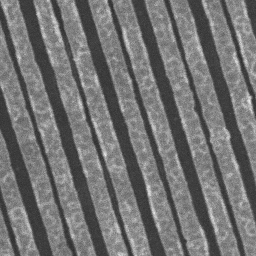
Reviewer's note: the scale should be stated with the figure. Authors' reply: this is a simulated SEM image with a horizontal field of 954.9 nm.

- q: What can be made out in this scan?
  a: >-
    parallel lines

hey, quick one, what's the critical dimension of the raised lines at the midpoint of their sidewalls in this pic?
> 0.0634 microns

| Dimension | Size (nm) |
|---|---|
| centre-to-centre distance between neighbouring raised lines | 101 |